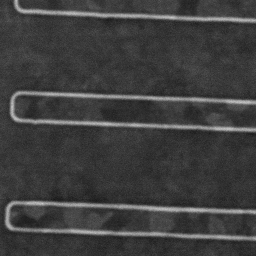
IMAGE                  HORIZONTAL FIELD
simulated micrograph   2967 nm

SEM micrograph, one or a few lines or trenches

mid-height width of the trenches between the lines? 952 nm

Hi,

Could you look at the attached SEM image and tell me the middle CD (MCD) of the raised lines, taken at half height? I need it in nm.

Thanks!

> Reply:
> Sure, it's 311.